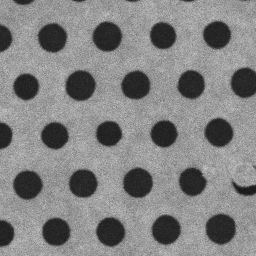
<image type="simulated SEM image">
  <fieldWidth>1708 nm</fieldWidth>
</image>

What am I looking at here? a regular array of holes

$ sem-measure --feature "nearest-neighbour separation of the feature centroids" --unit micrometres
0.364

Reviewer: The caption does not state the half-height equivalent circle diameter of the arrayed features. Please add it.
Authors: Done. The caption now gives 189 nm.